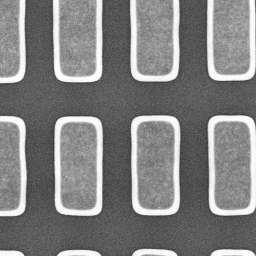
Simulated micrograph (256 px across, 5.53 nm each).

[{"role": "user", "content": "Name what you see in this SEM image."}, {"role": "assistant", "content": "groups of lines, slits or small figures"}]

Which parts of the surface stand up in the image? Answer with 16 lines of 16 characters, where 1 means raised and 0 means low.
1001110011100111
1001110011100111
1001110011100111
1000110011100111
1000110011100111
0000000000000000
0000000000000000
1000110001100010
1000110011100111
1000110011100111
1100110011100111
1100110011100111
1000110011100111
0000000000000000
0000000000000000
0000000000000000